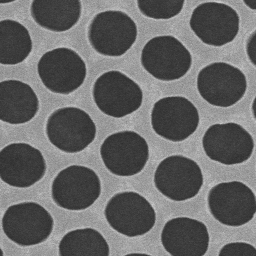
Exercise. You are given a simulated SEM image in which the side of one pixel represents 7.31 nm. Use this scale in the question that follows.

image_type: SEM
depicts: a regular array of holes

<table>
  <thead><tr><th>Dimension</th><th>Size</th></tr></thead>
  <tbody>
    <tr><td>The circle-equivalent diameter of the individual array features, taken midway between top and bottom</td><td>0.342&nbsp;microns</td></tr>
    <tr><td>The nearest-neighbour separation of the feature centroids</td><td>430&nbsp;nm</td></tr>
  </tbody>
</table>